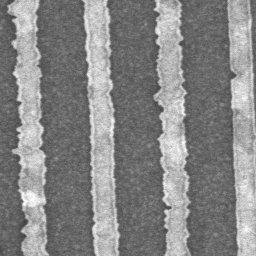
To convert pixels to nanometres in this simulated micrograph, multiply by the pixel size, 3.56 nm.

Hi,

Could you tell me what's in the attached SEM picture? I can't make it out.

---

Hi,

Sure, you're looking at one or a few lines or trenches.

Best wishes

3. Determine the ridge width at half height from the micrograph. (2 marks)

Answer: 75.1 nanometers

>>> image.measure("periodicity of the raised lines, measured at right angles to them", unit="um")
0.253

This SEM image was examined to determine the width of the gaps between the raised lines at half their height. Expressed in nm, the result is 180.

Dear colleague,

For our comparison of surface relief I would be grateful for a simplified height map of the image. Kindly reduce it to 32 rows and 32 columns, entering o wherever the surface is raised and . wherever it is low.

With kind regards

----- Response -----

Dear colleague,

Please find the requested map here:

.oooo......oo.......oo.......oo.
.ooo.......oo.......oo.......oo.
..oo.......ooo......oo.......oo.
..ooo......oo.......oo.......oo.
..oo.......ooo......oo.......oo.
..oo.......oo.......oo.......oo.
..ooo......ooo......ooo......oo.
..ooo......ooo......ooo......oo.
..ooo......ooo......ooo......ooo
..ooo......ooo......ooo......ooo
..ooo......ooo......ooo......oo.
..ooo......ooo......ooo......ooo
...oo......ooo......ooo......ooo
...oo......ooo......ooo......ooo
...oo......ooo......ooo......ooo
...oo......ooo......ooo......ooo
..ooo.......oo......ooo......ooo
..ooo......ooo......ooo......ooo
..ooo.......oo......ooo......ooo
..ooo.......oo......ooo......ooo
...oo.......oo......ooo......ooo
...ooo......oo.......oo......ooo
..ooo.......oo......ooo......ooo
...oo.......oo......ooo......ooo
...oo.......oo.......oo.......oo
...oo.......oo.......oo.......oo
...oo.......oo.......oo.......oo
...ooo......oo.......oo.......oo
...ooo......ooo......oo.......oo
...ooo......ooo......oo.......oo
...ooo......ooo......oo.......oo
...ooo......ooo......ooo......oo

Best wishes